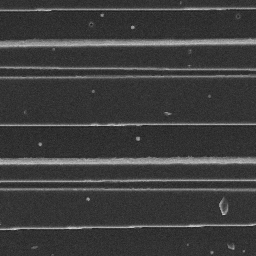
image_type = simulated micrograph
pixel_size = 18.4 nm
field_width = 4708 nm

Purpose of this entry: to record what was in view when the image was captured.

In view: lines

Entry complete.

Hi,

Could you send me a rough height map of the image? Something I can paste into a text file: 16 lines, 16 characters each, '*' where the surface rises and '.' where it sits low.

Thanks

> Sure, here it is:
****************
................
................
****************
****************
****************
****************
****************
................
................
****************
****************
****************
****************
................
................